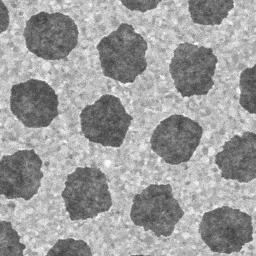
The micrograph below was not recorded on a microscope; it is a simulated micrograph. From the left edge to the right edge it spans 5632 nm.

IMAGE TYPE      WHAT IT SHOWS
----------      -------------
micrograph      a regular array of holes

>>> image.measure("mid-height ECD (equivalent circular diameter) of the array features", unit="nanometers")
1120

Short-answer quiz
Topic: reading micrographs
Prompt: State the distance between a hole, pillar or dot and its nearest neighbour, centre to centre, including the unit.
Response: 1560 nm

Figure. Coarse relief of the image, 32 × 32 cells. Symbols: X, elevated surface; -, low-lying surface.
-XXXXXXXXXXXXXX-----XXX------XXX
-XXXX-XXXXXXXXXXXXXXXXXX-----XXX
-XX------XXXXXXXXXXXXXXX----XXXX
-XX-------XXXXX--XXXXXXXXXXXXXXX
XXX-------XXX-----XXXXXXXXXXXXXX
XXX-------XX------XXXX--XXXXXXXX
XXXX-----XXX-X----XXXX-----XXXXX
XXXXXX-XXXXX------XXX------XXXXX
XXXXXXXXXXXXX-----XXX------XXXX-
XXXXXXXXXXXXX----XXXX------XXX--
XX----XXXXXXXXXXXXXXXX-----XXX--
X------XXXXXXXXXXXXXXX----XXXX--
X------XXXXX---XXXXXXXXXXXXXXX--
X------XXX------XXXXXXXXXXXXXX--
XX-----XXX------XXXXX--XXXXXXXXX
XXX---XXXX------XXXX-----XXXXXXX
XXXXXXXXXX------XXX------XXXXXXX
XXXXXXXXXXX-----XXX------XXX----
XXXXXXXXXXXXXXXXXXX------XXX----
-----XXXXXXXXXXXXXXX----XXX-----
-----XXXXXXXXXXXXXXXX--XXXX-----
-----XXXX----XXXXXXXXXXXXXXX----
-----XXX-----XXXXXXXXXXXXXXXX---
-----XXX------XXXX----XXXXXXXXXX
----XXXX------XXX-----XXXXXXXXXX
XXXXXXXX------XX------XXXXXXXXXX
XXXXXXXX-----XXX-------XXX-----X
XXXXXXXXX-XXXXXX-------XX-------
--XXXXXXXXXXXXXXXX----XXX-------
--XXXXXXXXXXXXXXXXXX-XXXX-------
---XXXX----XXXXXXXXXXXXXXX-X---X
---XXX-----XXXXXXXXXXXXXXXXX--XX